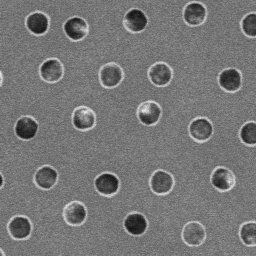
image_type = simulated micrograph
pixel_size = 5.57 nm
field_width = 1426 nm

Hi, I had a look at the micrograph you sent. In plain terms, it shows a regular array of holes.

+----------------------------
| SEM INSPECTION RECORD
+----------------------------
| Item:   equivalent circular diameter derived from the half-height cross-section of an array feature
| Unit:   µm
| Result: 0.129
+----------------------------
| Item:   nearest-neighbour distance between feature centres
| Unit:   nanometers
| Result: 274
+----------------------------